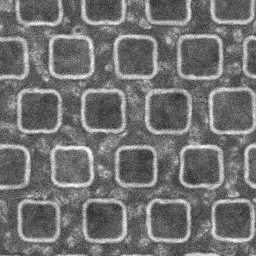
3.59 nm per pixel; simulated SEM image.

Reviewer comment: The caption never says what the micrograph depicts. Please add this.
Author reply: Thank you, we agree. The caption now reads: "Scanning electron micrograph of a regular array of raised bodies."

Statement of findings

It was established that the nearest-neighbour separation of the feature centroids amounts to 226 nanometres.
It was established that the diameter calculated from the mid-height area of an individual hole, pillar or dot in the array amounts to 163 nm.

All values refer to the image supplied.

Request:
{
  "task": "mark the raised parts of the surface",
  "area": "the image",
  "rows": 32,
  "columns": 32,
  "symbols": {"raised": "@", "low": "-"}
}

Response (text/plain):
--@@@@@@--@@@@@---@@@@@@---@@@@@
--@@@@@@--@@@@@---@@@@@@---@@@@@
--@@@@@----@@@@----@@@@----@@@@-
--------------------------------
---------------@@------@-@------
@@@---@@@@@---@@@@@---@@@@@@---@
@@@---@@@@@---@@@@@---@@@@@@---@
@@@---@@@@@@--@@@@@---@@@@@@---@
@@@---@@@@@@---@@@@---@@@@@@---@
@@@----@@@@----@@@@----@@@@----@
--------------------------------
---@@@@----@@@@----@@@@----@@@@-
--@@@@@@--@@@@@@--@@@@@@--@@@@@@
--@@@@@@--@@@@@@--@@@@@@--@@@@@@
--@@@@@@--@@@@@@--@@@@@@--@@@@@@
--@@@@@@--@@@@@@--@@@@@@--@@@@@@
----@@@------------@@@@----@@@@-
--------------------------------
@@@----@@@@----@@@@----@@@@----@
@@@@--@@@@@----@@@@----@@@@@---@
@@@@---@@@@----@@@@----@@@@@---@
@@@@---@@@@@---@@@@----@@@@@---@
@@@----@@@@----@@@@----@@@@@---@
--------------------------------
--------------------------------
---@@@@----@@@@----@@@@----@@@@-
--@@@@@----@@@@@---@@@@@---@@@@@
--@@@@@----@@@@@---@@@@@---@@@@@
--@@@@@----@@@@@---@@@@@---@@@@@
---@@@@----@@@@----@@@@@---@@@@-
--------------------------------
--------------------------------